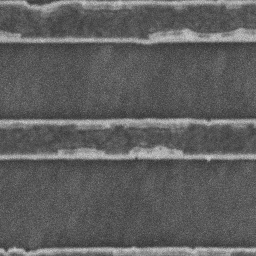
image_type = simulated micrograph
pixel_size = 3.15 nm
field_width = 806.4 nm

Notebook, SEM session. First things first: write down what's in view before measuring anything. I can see one or a few lines or trenches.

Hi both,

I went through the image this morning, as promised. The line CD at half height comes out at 117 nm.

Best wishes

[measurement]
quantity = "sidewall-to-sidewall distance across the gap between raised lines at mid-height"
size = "0.271 micrometres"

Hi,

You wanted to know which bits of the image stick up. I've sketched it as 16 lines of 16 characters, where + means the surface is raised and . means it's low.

++++++++++++++++
++++++++++++++++
++++++++++++....
................
................
................
................
................
++++++++++++++++
++++++++++++++++
................
................
................
................
................
................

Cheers